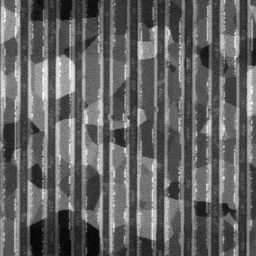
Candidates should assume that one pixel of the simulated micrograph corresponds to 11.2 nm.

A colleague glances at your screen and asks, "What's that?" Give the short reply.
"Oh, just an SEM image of parallel lines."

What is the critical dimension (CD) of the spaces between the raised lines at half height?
10.6 px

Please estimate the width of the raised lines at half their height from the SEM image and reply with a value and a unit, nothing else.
190 nm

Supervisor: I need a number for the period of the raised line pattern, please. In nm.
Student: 306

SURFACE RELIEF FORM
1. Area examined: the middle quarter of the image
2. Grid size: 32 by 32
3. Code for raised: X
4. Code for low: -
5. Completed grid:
XX---XXXX---XXXX---XXXX---XXXX--
XX---XXXX---XXXX---XXXX---XXXX--
XX---XXXX---XXXX---XXXX---XXXX--
XX---XXXX---XXXX---XXXX---XXXX--
XX---XXXX---XXXX---XXXX---XXXX--
XX---XXXX---XXXX---XXXX---XXXX--
XX---XXXX---XXXX---XXXX---XXXX--
XX---XXXX---XXXX---XXXX---XXXX--
XX---XXXX---XXXX---XXXX---XXXX--
XX---XXXX---XXXX---XXXX---XXXX--
XX---XXXX---XXXX---XXXX---XXXX--
XX---XXXX---XXXX---XXXX---XXXX--
XX---XXXX---XXXX---XXXX---XXXX--
XX---XXXX--XXXXX---XXXX---XXXX--
XX---XXXX---XXXX---XXXX---XXXX--
XX---XXXX---XXXX---XXXX---XXXX--
XX---XXXX---XXXX---XXXX---XXXX--
XX---XXXX---XXXX---XXXX---XXXX--
XX---XXXX---XXXX---XXXX---XXXX--
XX---XXXX---XXXX---XXXX---XXXX--
XX---XXXX---XXXX---XXXX---XXXX--
XX---XXXX---XXXX---XXXX---XXXX--
XX---XXXX---XXXX---XXXX---XXX---
XX---XXXX---XXXX---XXXX---XXX---
XX---XXXX---XXXX---XXXX---XXX---
XX---XXXX---XXXX---XXXX---XXX---
XX---XXXX---XXXX---XXXX---XXX---
XX---XXXX---XXXX---XXXX---XXX---
XX---XXXX---XXXX---XXXX--XXXX---
XX---XXXX---XXXX---XXXX--XXXX---
XX---XXXX---XXXX---XXXX--XXXX---
XX---XXXX---XXXX---XXXX---XXX---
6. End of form